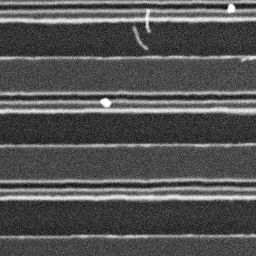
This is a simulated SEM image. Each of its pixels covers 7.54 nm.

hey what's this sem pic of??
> lines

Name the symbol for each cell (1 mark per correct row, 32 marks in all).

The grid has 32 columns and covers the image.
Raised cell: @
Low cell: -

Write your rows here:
@@@@@@@@@@@@@@@@@@@@@@@@@@@@@@@@
@@@@@@@@@@@@@@@@@@@@@@@@@@@@@@@@
@-@@@@@@@@@@@@@---@-------------
--------------------------------
--------------------------------
--------------------------------
--------------------------------
@@@@@@@@@@@@@@@@@@@@@@@@@@@@@@@@
@@@@@@@@@@@@@@@@@@@@@@@@@@@@@@@@
@@@@@@@@@@@@@@@@@@@@@@@@@@@@@@@@
@@@@@@@@@@@@@@@@@@@@@@@@@@@@@@@@
@@@@@@@@@@@@@@@@@@@@@@@@@@@@@@@@
@@@@@@@@@@@@@@@@@@@@@@@@@@@@@@@@
@@@@@@@@@@@@@@@@@@@@@@@@@@@@@@@@
--------------------------------
--------------------------------
--------------------------------
--------------------------------
@@@@@@@@@@@@@@@@@@@@@@@@@@@@@@@@
@@@@@@@@@@@@@@@@@@@@@@@@@@@@@@@@
@@@@@@@@@@@@@@@@@@@@@@@@@@@@@@@@
@@@@@@@@@@@@@@@@@@@@@@@@@@@@@@@@
@@@@@@@@@@@@@@@@@@@@@@@@@@@@@@@@
@@@@@@@@@@@@@@@@@@@@@@@@@@@@@@@@
@@@@@@@@@@@@@@@@@@@@@@@@@@@@@@@@
--------------------------------
--------------------------------
--------------------------------
--------------------------------
--------@@@@@@--@@@@@@@@@@@@@@@@
@@@@@@@@@@@@@@@@@@@@@@@@@@@@@@@@
@@@@@@@@@@@@@@@@@@@@@@@@@@@@@@@@